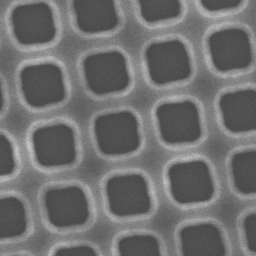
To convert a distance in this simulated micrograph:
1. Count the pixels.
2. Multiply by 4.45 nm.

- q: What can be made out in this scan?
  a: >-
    a regular array of holes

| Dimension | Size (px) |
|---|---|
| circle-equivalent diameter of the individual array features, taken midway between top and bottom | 48.9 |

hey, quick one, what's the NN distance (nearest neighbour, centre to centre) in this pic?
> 276 nanometres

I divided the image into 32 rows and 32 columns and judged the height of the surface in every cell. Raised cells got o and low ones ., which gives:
oo....ooo......oo......oo.....oo
o......oo......oo......ooo..oooo
o......oo......ooo....oooooooooo
o......ooo.....ooooooooooooo...o
oo.....ooooooooooooooooooo.....o
oo....ooooooooooooo....ooo......
oooooooooooo...ooo......oo......
oooooooooo......oo......oo......
ooo.....oo......oo......ooo....o
oo......oo......oo......oooooooo
oo......ooo.....ooo...oooooooooo
ooo.....ooo....ooooooooooooo....
.oo.....ooooooooooooooo.ooo.....
.ooo..ooooooooooooo......oo.....
oooooooooooo.....oo......oo.....
oooooo...ooo.....ooo.....ooo....
oooo.....ooo.....ooo.....ooo...o
.ooo......oo......oo.....ooooooo
..oo......oo.....ooooooooooooooo
..oo......ooo..oooooooooooooo...
..ooo....oooooooooooo.....ooo...
..ooooooooooooooooooo.....ooo...
ooooooooooooo.....ooo......oo...
oooooo....ooo......oo......oo...
..ooo......oo......oo......ooooo
...oo......oo......ooo..oooooooo
...ooo.....ooo.....oooooooooooo.
....oo.....ooooooooooooooooooo..
....ooo...ooooooooooooo.....oo..
...oooooooooooo....ooo......oo..
oooooooooo.oooo.....oo......ooo.
ooooooo.....ooo.....ooo.....ooo.